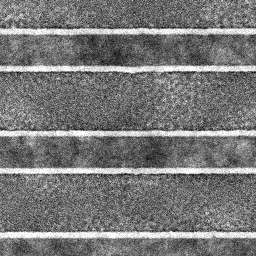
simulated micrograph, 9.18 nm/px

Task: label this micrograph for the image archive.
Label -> one or a few lines or trenches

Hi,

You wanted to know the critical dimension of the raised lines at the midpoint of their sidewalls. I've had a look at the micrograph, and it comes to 0.352 um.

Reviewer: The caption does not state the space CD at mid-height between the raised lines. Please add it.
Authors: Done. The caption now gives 578 nm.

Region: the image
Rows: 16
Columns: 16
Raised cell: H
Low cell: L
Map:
LLLLLLLLLLLLLLLL
LLLLLLLLLLLLLLLL
HHHHHHHHHHHHHHHH
HHHHHHHHHHHHHHHH
LLLLLLLLLLLLLLLL
LLLLLLLLLLLLLLLL
LLLLLLLLLLLLLLLL
LLLLLLLLLLLLLLLL
HHHHHHHHHHHHHHHH
HHHHHHHHHHHHHHHH
HHHHHHHHHHHHHHHH
LLLLLLLLLLLLLLLL
LLLLLLLLLLLLLLLL
LLLLLLLLLLLLLLLL
LLLLLLLLLLLLLLLL
HHHHHHHHHHHHHHHH